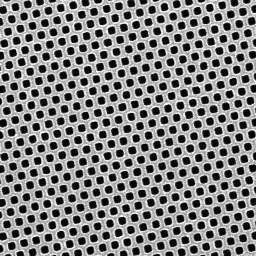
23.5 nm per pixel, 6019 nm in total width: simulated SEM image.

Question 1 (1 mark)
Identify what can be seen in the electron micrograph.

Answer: a regular array of holes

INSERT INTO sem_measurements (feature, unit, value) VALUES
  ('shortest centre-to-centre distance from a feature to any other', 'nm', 292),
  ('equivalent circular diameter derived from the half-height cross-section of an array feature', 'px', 8.21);